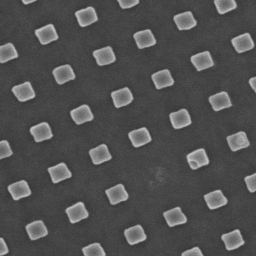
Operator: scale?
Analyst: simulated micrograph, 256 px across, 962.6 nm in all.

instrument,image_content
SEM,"a regular array of raised bodies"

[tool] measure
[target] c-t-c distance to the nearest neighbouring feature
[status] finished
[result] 164 nanometres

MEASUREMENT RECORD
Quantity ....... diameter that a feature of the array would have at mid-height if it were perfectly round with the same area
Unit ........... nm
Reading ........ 71.9